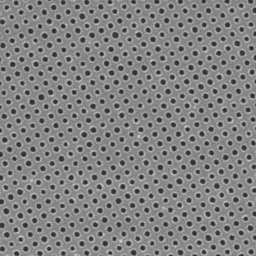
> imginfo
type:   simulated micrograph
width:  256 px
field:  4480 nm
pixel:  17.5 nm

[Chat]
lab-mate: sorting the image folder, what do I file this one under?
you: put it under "a regular array of holes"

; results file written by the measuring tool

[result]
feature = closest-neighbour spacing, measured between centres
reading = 181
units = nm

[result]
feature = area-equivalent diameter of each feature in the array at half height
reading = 96.7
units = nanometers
